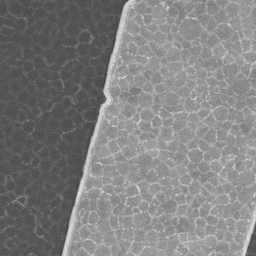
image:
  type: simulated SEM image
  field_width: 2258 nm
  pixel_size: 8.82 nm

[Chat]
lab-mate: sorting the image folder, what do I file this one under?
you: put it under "one or a few lines or trenches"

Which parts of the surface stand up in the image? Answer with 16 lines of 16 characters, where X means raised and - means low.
--------XXXXXXXX
--------XXXXXXXX
-------XXXXXXXXX
-------XXXXXXXXX
-------XXXXXXXXX
-------XXXXXXXXX
-------XXXXXXXXX
------XXXXXXXXXX
------XXXXXXXXXX
------XXXXXXXXXX
-----XXXXXXXXXXX
-----XXXXXXXXXXX
-----XXXXXXXXXXX
-----XXXXXXXXXXX
----XXXXXXXXXXXX
----XXXXXXXXXXX-